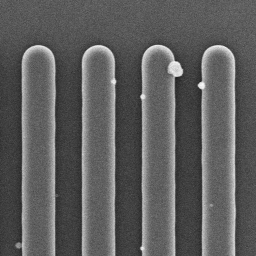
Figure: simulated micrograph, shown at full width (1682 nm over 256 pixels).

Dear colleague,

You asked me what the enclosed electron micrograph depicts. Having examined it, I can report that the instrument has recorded groups of lines, slits or small figures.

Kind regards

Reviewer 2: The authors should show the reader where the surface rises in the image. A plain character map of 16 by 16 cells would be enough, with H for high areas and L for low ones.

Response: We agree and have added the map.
LLLLLLLLLLLLLLLL
LLLLLLLLLLLLLLLL
LLLLLLLLLLLLLLLL
LLHLLHHLLHHLLHHL
LHHLLHHLLHHLLHHL
LHHLLHHLLHHLLHHL
LHHLLHHLLHHLLHHL
LHHLLHHLLHHLLHHL
LHHLLHHLLHHLLHHL
LHHLLHHLLHHLLHHL
LHHLLHHLLHHLLHHL
LHHLLHHLLHHLLHHL
LHHLLHHLLHHLLHHL
LHHLLHHLLHHLLHHL
LHHLLHHLLHHLLHHL
LHHLLHHLLHHLLHHL